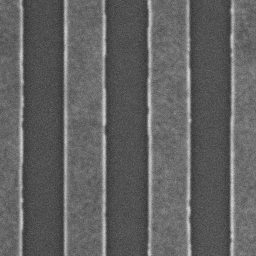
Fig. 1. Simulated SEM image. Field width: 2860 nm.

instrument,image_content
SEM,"lines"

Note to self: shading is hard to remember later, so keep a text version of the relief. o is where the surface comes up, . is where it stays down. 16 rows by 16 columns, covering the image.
o...oo...ooo...o
o...ooo..ooo...o
o...ooo..ooo..oo
o...ooo..ooo..oo
o...oo...ooo...o
o...ooo..ooo...o
o...ooo..ooo...o
o...ooo..ooo..oo
o...ooo..ooo..oo
o...ooo..ooo..oo
o...ooo..ooo..oo
o...ooo..ooo..oo
o...ooo..ooo..oo
o...ooo..ooo..oo
o...ooo..ooo..oo
o...ooo..ooo..oo